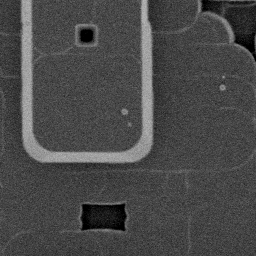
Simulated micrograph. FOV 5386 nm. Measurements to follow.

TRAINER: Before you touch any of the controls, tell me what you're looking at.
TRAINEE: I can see wiring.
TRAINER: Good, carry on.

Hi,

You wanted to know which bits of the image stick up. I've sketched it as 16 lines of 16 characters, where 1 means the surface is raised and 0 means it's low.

0011111110000000
0011111110000000
0011101110000000
0011111110000000
0011111110000000
0011111110000000
0011111110000000
0011111110000000
0011111110000000
0011111110000000
0000000000000000
0000000000000000
0000000000000000
0000000000000000
0000000000000000
0000000000000000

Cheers